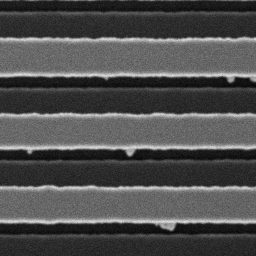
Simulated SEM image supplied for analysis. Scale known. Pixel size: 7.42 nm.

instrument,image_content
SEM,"lines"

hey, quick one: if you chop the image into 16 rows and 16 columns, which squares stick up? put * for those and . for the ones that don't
................
................
****************
****************
****************
................
................
****************
****************
................
................
................
****************
****************
................
................